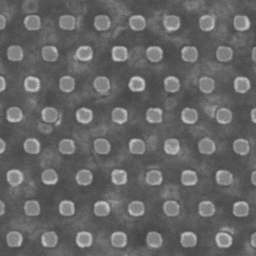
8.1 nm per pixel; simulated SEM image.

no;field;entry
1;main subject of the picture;a regular array of raised bodies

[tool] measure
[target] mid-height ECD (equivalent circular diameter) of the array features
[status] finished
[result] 124 nm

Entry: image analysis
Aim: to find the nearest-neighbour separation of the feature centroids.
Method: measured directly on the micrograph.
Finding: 0.282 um